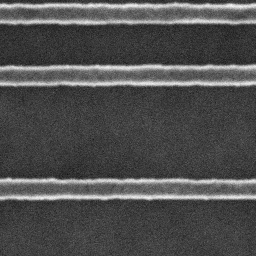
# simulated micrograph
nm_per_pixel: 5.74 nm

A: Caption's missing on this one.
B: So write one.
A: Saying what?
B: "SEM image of lines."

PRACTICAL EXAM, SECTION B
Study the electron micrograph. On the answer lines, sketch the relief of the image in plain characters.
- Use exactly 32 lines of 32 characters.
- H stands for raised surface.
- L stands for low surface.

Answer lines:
LLLLLLLLLLLLLLLLLLLLLHLLLLLLLLLL
HHHHHHHHHHHHHHHHHHHHHHHHHHHHHHHH
HHHHHHHHHHHHHHHHHHHHHHHHHHHHHHHH
LLLLLLLLLLLLLLLLLLLLLLLLLLLLLLLL
LLLLLLLLLLLLLLLLLLLLLLLLLLLLLLLL
LLLLLLLLLLLLLLLLLLLLLLLLLLLLLLLL
LLLLLLLLLLLLLLLLLLLLLLLLLLLLLLLL
LLLLLLLLLLLLLLLLLLLLLLLLLLLLLLLL
HHHHHHHHHHHHHHHHHHHHHHHHHHHHHHHH
HHHHHHHHHHHHHHHHHHHHHHHHHHHHHHHH
HHHHHHHLHHHHHHHLHHLHHHHHLHHHHHHL
LLLLLLLLLLLLLLLLLLLLLLLLLLLLLLLL
LLLLLLLLLLLLLLLLLLLLLLLLLLLLLLLL
LLLLLLLLLLLLLLLLLLLLLLLLLLLLLLLL
LLLLLLLLLLLLLLLLLLLLLLLLLLLLLLLL
LLLLLLLLLLLLLLLLLLLLLLLLLLLLLLLL
LLLLLLLLLLLLLLLLLLLLLLLLLLLLLLLL
LLLLLLLLLLLLLLLLLLLLLLLLLLLLLLLL
LLLLLLLLLLLLLLLLLLLLLLLLLLLLLLLL
LLLLLLLLLLLLLLLLLLLLLLLLLLLLLLLL
LLLLLLLLLLLLLLLLLLLLLLLLLLLLLLLL
LLLLLLLLLLLLLLLLLLLLLLLLLLLLLLLL
HHHHHHHLHLLHHHHHHHHHHHHHLLLLLLLH
HHHHHHHHHHHHHHHHHHHHHHHHHHHHHHHH
HHHHHHHHHHHHHHHHHHHHHHHHHHHHHHHH
LLLLLLLLLLLLLLLLLLLLLLLLLLLLLLLL
LLLLLLLLLLLLLLLLLLLLLLLLLLLLLLLL
LLLLLLLLLLLLLLLLLLLLLLLLLLLLLLLL
LLLLLLLLLLLLLLLLLLLLLLLLLLLLLLLL
LLLLLLLLLLLLLLLLLLLLLLLLLLLLLLLL
LLLLLLLLLLLLLLLLLLLLLLLLLLLLLLLL
LLLLLLLLLLLLLLLLLLLLLLLLLLLLLLLL